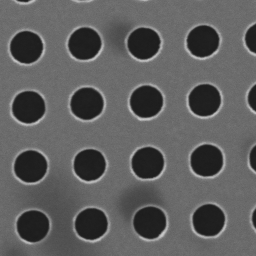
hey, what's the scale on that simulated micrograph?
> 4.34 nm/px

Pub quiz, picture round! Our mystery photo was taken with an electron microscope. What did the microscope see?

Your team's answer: a regular array of holes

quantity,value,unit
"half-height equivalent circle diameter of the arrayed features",139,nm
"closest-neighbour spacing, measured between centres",253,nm